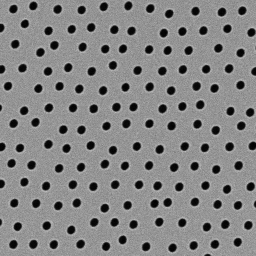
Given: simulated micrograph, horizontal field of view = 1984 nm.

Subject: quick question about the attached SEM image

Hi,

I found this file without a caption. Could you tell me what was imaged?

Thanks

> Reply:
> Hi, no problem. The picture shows a regular array of holes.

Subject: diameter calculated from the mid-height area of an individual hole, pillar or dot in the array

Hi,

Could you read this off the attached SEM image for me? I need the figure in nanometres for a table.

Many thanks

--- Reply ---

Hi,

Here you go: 63.7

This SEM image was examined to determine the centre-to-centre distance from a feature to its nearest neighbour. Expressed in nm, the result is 149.